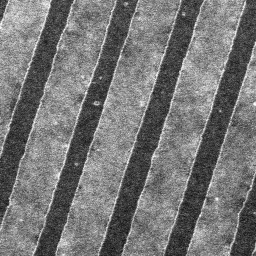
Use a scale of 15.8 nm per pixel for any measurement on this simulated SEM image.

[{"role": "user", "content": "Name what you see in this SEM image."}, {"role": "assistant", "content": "one or a few lines or trenches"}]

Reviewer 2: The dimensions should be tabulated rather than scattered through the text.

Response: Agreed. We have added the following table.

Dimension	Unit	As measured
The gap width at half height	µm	0.624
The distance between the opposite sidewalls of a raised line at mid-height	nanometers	359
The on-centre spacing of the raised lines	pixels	62.1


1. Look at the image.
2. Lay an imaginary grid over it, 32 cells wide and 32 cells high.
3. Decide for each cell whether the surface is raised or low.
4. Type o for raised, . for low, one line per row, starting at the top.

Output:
o.....ooo.....ooo.....ooo......o
o.....ooo.....ooo.....ooo.....oo
......oo......ooo.....ooo.....oo
.....ooo.....ooo......oo......oo
.....ooo.....ooo.....ooo.....ooo
.....oo......ooo.....ooo.....ooo
....ooo......oo......oo......ooo
....ooo.....ooo.....ooo.....ooo.
....ooo.....ooo.....ooo.....ooo.
...ooo.....ooo......oo......ooo.
...ooo.....ooo.....ooo.....ooo..
...ooo.....ooo.....ooo.....ooo..
..ooo.....ooo......ooo.....ooo..
..ooo.....ooo.....ooo.....ooo...
.oooo.....ooo.....ooo.....ooo...
.ooo.....ooo......ooo.....ooo...
.ooo.....ooo.....ooo.....ooo....
.ooo.....ooo.....ooo.....ooo....
ooo.....ooo......ooo.....ooo....
ooo.....ooo.....ooo.....ooo.....
ooo.....ooo.....ooo.....ooo.....
oo......oo......ooo.....ooo.....
oo.....ooo.....ooo.....ooo......
oo.....ooo.....ooo.....ooo.....o
o......oo......ooo.....ooo.....o
o.....ooo.....ooo......ooo.....o
o.....ooo.....ooo.....ooo.....oo
......oo......ooo.....ooo.....oo
.....ooo.....ooo.....ooo......oo
.....ooo.....ooo.....ooo.....ooo
.....oo......ooo.....ooo.....ooo
....ooo.....ooo......oo......ooo